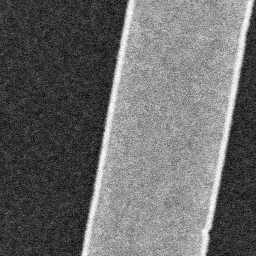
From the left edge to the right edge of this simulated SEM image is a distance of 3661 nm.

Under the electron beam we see one or a few lines or trenches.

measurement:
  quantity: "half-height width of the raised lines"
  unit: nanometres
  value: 1670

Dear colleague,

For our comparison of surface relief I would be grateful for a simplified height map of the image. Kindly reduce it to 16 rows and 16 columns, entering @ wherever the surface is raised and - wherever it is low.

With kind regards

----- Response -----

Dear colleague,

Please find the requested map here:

--------@@@@@@@@
--------@@@@@@@-
--------@@@@@@@-
--------@@@@@@@-
-------@@@@@@@@-
-------@@@@@@@@-
-------@@@@@@@--
-------@@@@@@@--
-------@@@@@@@--
------@@@@@@@@--
------@@@@@@@@--
------@@@@@@@@--
------@@@@@@@---
------@@@@@@@---
------@@@@@@@---
-----@@@@@@@@---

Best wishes